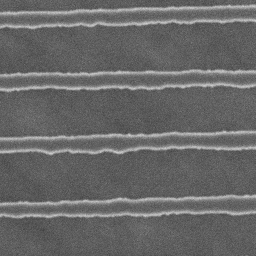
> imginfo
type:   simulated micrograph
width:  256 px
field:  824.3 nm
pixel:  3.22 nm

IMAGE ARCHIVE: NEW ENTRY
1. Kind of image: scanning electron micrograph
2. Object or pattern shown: lines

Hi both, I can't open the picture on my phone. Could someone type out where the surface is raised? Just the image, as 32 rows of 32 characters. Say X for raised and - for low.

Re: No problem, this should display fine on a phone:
--------------------------------
--------XXXXXXXXXXXXXXXXXXXXXXXX
XXXXXXXXXXXXXXXXXXXXXXXXXXXXXXXX
---XX---------------------------
--------------------------------
--------------------------------
--------------------------------
--------------------------------
--------------------------------
XXXXXXXXXXXXXXXXXXXXXXXXXXXXXXXX
XXXXXXXXXXXXXXXXXXXXXXXXXXXXXXXX
--------------------------------
--------------------------------
--------------------------------
--------------------------------
--------------------------------
---------------------------XXXXX
XXXXXXXXXXXXXXXXXXXXXXXXXXXXXXXX
XXXXXXXXXXXXXXXXXXXXXXX-XXXXXXXX
--------------------------------
--------------------------------
--------------------------------
--------------------------------
--------------------------------
----------------------------XXXX
XXXXXXXXXXXXXXXXXXXXXXXXXXXXXXXX
XXXXXXXXXXXXXXXXXXXXXXXXXXXXXXXX
--------------------------------
--------------------------------
--------------------------------
--------------------------------
--------------------------------